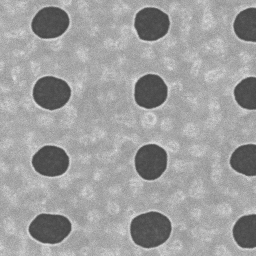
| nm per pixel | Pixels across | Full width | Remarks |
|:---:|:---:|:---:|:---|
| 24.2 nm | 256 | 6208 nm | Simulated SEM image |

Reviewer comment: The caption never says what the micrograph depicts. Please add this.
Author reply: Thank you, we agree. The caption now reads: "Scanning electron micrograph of a regular array of holes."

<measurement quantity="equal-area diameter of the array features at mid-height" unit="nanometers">864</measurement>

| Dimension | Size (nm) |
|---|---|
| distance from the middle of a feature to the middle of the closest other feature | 1640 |